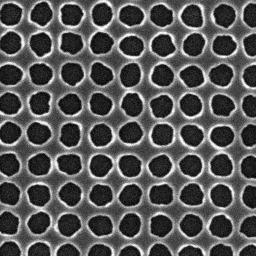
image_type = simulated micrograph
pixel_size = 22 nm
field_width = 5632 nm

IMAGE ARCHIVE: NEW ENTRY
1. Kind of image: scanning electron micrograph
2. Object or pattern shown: a regular array of holes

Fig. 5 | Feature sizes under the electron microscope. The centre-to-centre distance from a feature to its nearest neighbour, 0.644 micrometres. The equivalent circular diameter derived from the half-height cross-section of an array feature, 518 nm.